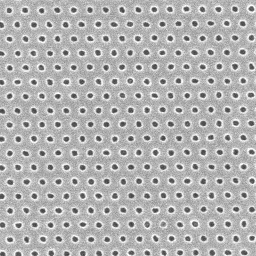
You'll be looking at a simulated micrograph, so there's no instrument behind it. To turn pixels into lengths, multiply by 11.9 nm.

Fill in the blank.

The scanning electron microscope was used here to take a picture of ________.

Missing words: a regular array of holes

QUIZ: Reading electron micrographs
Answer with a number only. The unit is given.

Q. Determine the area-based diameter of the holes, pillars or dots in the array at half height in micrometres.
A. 0.0756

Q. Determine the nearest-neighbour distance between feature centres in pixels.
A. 15.8